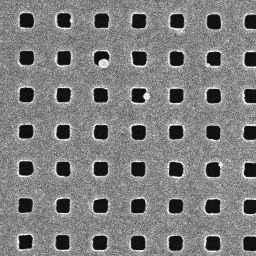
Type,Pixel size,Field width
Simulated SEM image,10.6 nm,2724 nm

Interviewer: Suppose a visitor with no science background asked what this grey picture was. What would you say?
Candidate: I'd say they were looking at a regular array of holes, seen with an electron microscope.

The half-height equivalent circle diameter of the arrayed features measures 166 nanometers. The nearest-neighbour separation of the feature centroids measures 390 nm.